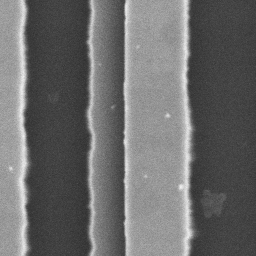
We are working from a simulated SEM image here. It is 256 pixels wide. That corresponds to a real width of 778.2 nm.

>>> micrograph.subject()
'lines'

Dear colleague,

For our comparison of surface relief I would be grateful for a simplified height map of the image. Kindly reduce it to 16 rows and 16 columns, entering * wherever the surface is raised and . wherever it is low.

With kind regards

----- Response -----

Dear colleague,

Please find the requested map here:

*.....******....
*.....******....
*.....******....
*.....******....
*.....******....
*.....******....
*.....******....
*.....******....
**....******....
**....******....
**....******....
*.....******....
*.....******....
**....******....
*.....******....
**....******....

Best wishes